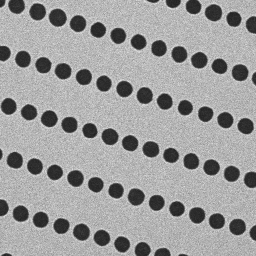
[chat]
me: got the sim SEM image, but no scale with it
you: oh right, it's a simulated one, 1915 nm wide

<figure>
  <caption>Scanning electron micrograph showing a regular array of holes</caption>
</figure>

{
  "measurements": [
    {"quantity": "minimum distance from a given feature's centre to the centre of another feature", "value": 0.157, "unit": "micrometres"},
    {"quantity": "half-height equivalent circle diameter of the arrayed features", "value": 0.121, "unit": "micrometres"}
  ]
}